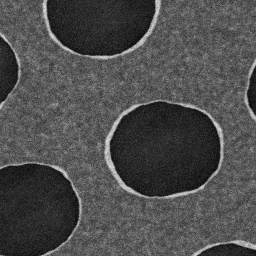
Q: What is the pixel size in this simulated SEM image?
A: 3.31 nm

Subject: holes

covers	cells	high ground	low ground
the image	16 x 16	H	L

HHHLLLLLLLHHHHHH
HHHLLLLLLLHHHHHH
HHHLLLLLLHHHHHHH
LHHHHHLHHHHHHHHH
LHHHHHHHHHHHHHHH
LHHHHHHHHHHHHHHH
HHHHHHHHHLLHHHHL
HHHHHHHLLLLLLHHH
HHHHHHHLLLLLLLHH
HHHHHHHLLLLLLLHH
LLLHHHHLLLLLLLHH
LLLLHHHHLLLLLHHH
LLLLLHHHHHHHHHHH
LLLLLHHHHHHHHHHH
LLLLLHHHHHHHHHHH
LLLHHHHHHHHHHLLL